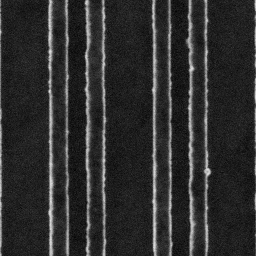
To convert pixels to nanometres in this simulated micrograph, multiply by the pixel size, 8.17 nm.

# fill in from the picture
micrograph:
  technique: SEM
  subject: lines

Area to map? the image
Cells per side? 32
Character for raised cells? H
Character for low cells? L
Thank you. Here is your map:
LLLLLLHHLLLHHLLLLLLHHLLLHHLLLLLL
LLLLLLHHLLLHHLLLLLLHHLLLHHLLLLLL
LLLLLLHHLLLHHLLLLLLHHLLLHHLLLLLL
LLLLLLHHLLLHHLLLLLLHHLLLHHLLLLLL
LLLLLLHHLLLHHLLLLLLHHLLLHHLLLLLL
LLLLLLHHLLLHHLLLLLLHHLLLHHLLLLLL
LLLLLLHHLLLHHLLLLLLHHLLLHHLLLLLL
LLLLLLHHLLLHHLLLLLLHHLLLHHLLLLLL
LLLLLLHHLLLHHLLLLLLHHLLLHHLLLLLL
LLLLLLHHLLLHHLLLLLLHHLLLHHLLLLLL
LLLLLLHHLLLHHLLLLLLHHLLLHHLLLLLL
LLLLLLHHLLLHHLLLLLLHHLLLHHLLLLLL
LLLLLLHHLLLHHLLLLLLHHLLLHHLLLLLL
LLLLLLHHLLLHHLLLLLLHHLLLHHLLLLLL
LLLLLLHHLLLHHLLLLLLHHLLLHHLLLLLL
LLLLLLHHLLLHHLLLLLLHHLLLHHLLLLLL
LLLLLLHHLLLHHLLLLLLHHLLLHHLLLLLL
LLLLLLHHLLLHHLLLLLLHHLLLHHLLLLLL
LLLLLLHHLLLHHLLLLLLHHLLLHHLLLLLL
LLLLLLHHLLLHHLLLLLLHHLLLHHLLLLLL
LLLLLLHHLLLHHLLLLLLHHLLLHHLLLLLL
LLLLLLHHLLLHHLLLLLLHHLLLHHLLLLLL
LLLLLLHHLLLHHLLLLLLHHLLLHHLLLLLL
LLLLLLHHLLLHHLLLLLLHHLLLHHLLLLLL
LLLLLLHHLLLHHLLLLLLHHLLLHHLLLLLL
LLLLLLHHLLLHHLLLLLLHHLLLHHLLLLLL
LLLLLLHHLLLHHLLLLLLHHLLLHHLLLLLL
LLLLLLHHLLLHHLLLLLLHHLLLHHLLLLLL
LLLLLLHHLLLHHLLLLLLHHLLLHHLLLLLL
LLLLLLHHLLLHHLLLLLLHHLLLHHLLLLLL
LLLLLLHHLLLHHLLLLLLHHLLLHHLLLLLL
LLLLLLHHLLLHHLLLLLLHHLLLHHLLLLLL